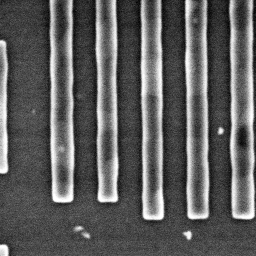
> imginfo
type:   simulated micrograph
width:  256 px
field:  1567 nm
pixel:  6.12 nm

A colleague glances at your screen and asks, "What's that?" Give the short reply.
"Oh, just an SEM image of wiring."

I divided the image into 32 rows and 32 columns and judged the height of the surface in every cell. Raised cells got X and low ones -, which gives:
------XXX---XX----XX---XXX---XX-
------XXX---XX----XX---XXX---XX-
------XXX---XX----XX---XXX---XX-
------XXX---XX----XX---XXX---XX-
------XXX---XX----XX---XXX---XX-
X-----XXX---XXX---XX---XXX---XX-
X-----XXX---XXX---XX---XXX---XX-
X-----XXX---XX----XX---XXX---XX-
X-----XXX---XX----XX---XXX---XX-
X-----XXX---XX----XX---XXX---XX-
X-----XXX---XX----XX---XXX---XX-
X-----XXX---XX----XX---XXX---XX-
X-----XXX---XX----XX---XXX---XX-
X-----XXX---XX----XX---XXX---XXX
X-----XXX---XXX---XX---XXX---XXX
X-----XXX---XXX---XX---XXX---XX-
X-----XXX---XXX---XX---XXX---XXX
X-----XXX---XXX---XX---XXX---XXX
X-----XXX---XXX---XX---XXX---XXX
X------XX---XXX---XX---XXX---XXX
X------XX---XXX---XX---XXX---XXX
-------XX---XXX---XX---XXX---XXX
-------XX---XXX---XX---XXX---XXX
-------XX---XX----XX---XXX---XXX
-------XX---XXX---XX---XXX---XXX
------------------XX---XXX---XXX
------------------XX----XX---XXX
--------------------------------
--------------------------------
--------------------------------
--------------------------------
X-------------------------------